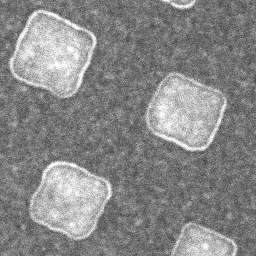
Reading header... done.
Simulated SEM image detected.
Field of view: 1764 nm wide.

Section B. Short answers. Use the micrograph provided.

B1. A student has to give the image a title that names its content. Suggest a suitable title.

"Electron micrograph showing holes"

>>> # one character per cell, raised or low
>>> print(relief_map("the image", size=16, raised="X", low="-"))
XXXXXXXXXXXXXXXX
XX--XXXXXXXXXXXX
X-----XXXXXXXXXX
X-----XXXXXXXXXX
X----XXXXXXXXXXX
XXX--XXXXX---XXX
XXXXXXXXX-----XX
XXXXXXXXX-----XX
XXXXXXXXXX---XXX
XXXXXXXXXXXXXXXX
XXX--XXXXXXXXXXX
XXX----XXXXXXXXX
XX-----XXXXXXXXX
XX----XXXXXXXXXX
XXXX--XXXXX--XXX
XXXXXXXXXXX----X